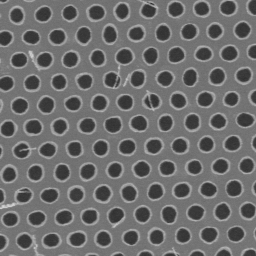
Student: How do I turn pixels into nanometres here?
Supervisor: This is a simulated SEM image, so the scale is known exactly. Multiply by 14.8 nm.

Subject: a regular array of holes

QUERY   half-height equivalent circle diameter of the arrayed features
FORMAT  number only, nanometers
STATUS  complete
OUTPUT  234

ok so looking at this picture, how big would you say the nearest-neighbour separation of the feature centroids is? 377 nm